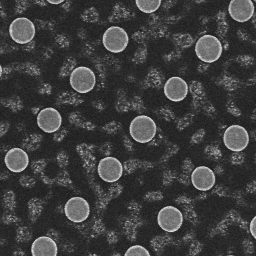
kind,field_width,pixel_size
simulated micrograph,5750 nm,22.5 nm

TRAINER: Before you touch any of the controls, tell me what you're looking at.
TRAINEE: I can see a regular array of raised bodies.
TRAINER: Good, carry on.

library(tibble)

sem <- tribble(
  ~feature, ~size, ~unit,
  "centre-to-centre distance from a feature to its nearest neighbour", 1.17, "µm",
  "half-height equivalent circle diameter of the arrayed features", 0.547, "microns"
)